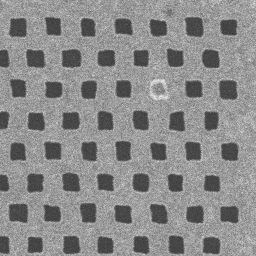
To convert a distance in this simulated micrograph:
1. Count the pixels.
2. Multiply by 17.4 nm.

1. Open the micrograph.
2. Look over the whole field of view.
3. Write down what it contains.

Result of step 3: a regular array of holes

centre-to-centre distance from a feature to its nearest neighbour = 599 nm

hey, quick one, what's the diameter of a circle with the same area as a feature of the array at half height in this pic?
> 0.327 microns